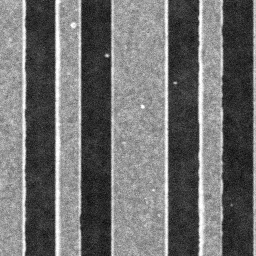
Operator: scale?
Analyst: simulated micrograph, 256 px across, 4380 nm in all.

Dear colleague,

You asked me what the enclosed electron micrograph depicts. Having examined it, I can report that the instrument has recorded lines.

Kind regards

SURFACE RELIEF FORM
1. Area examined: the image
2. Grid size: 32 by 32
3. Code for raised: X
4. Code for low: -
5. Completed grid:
XXX----XXX----XXXXXXX----XXX----
XXX----XXX----XXXXXXX----XXX----
XXX----XXX----XXXXXXX----XXX----
XXX----XXX----XXXXXXX----XXX----
XXX----XXX----XXXXXXX----XXX----
XXX----XXX----XXXXXXX----XXX----
XXX----XXX----XXXXXXX----XXX----
XXX----XXX----XXXXXXX----XXX----
XXX----XXX----XXXXXXX----XXX----
XXX----XXX----XXXXXXX----XXX----
XXX----XXX----XXXXXXX----XXX----
XXX----XXX----XXXXXXX----XXX----
XXX----XXX----XXXXXXX----XXX----
XXX----XXX----XXXXXXX----XXX----
XXX----XXX----XXXXXXX----XXX----
XXX----XXX----XXXXXXX----XXX----
XXX----XXX----XXXXXXX----XXX----
XXX----XXX----XXXXXXX----XXX----
XXX----XXX----XXXXXXX----XXX----
XXX----XXX----XXXXXXX----XXX----
XXX----XXX----XXXXXXX----XXX----
XXX----XXX----XXXXXXX----XXX----
XXX----XXX----XXXXXXX----XXX----
XXX----XXX----XXXXXXX----XXX----
XXX----XXX----XXXXXXX----XXX----
XXX----XXX----XXXXXXX----XXX----
XXX----XXX----XXXXXXX----XXX----
XXX----XXX----XXXXXXX----XXX----
XXX----XXX----XXXXXXX----XXX----
XXX----XXX----XXXXXXX----XXX----
XXX----XXX----XXXXXXX----XXX----
XXX----XXX----XXXXXXX----XXX----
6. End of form